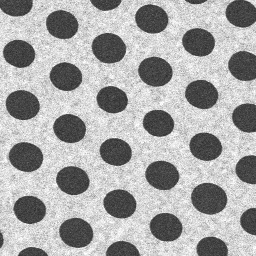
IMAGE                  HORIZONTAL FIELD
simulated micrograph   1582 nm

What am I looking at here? a regular array of holes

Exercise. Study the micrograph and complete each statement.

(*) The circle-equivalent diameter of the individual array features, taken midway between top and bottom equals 0.19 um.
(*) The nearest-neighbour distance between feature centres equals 319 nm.